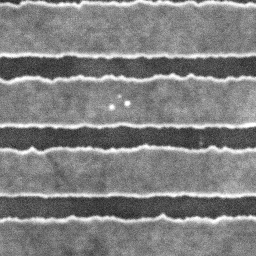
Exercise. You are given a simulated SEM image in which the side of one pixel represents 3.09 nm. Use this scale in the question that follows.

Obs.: lines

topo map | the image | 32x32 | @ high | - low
@-@@@@--@@@@@@@@@@@@@@@@@@@@@@-@
@@@@@@@@@@@@@@@@@@@@@@@@@@@@@@@@
@@@@@@@@@@@@@@@@@@@@@@@@@@@@@@@@
@@@@@@@@@@@@@@@@@@@@@@@@@@@@@@@@
@@@@@@@@@@@@@@@@@@@@@@@@@@@@@@@@
@@@@@@@@@@@@@@@@@@@@@@@@@@@@@@@@
@@@@@@@@@@@@@@@@@@@@@@@@@@@@@@@@
--------------------------------
--------------------------------
-------------@------@@-@--------
@@@@@@@@@@@@@@@@@@@@@@@@@@@@@@@@
@@@@@@@@@@@@@@@@@@@@@@@@@@@@@@@@
@@@@@@@@@@@@@@@@@@@@@@@@@@@@@@@@
@@@@@@@@@@@@@@@@@@@@@@@@@@@@@@@@
@@@@@@@@@@@@@@@@@@@@@@@@@@@@@@@@
@@@@@@@@@@@@@@@@@@@@@@@@@@@@@@@@
--------------------------------
--------------------------------
-------@---------@@@@@----@-----
@@@@@@@@@@@@@@@@@@@@@@@@@@@@@@@@
@@@@@@@@@@@@@@@@@@@@@@@@@@@@@@@@
@@@@@@@@@@@@@@@@@@@@@@@@@@@@@@@@
@@@@@@@@@@@@@@@@@@@@@@@@@@@@@@@@
@@@@@@@@@@@@@@@@@@@@@@@@@@@@@@@@
-@---@@@@@@@@@-@@@@--@--@@@@@@@-
--------------------------------
--------------------------------
@@@@@@@@@@@@@@@@@@@@@@@@@@@@@@@@
@@@@@@@@@@@@@@@@@@@@@@@@@@@@@@@@
@@@@@@@@@@@@@@@@@@@@@@@@@@@@@@@@
@@@@@@@@@@@@@@@@@@@@@@@@@@@@@@@@
@@@@@@@@@@@@@@@@@@@@@@@@@@@@@@@@